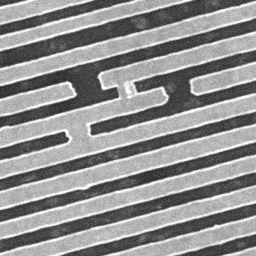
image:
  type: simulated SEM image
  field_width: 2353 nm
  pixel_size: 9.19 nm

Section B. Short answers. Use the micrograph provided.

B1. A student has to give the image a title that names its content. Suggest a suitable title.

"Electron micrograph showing parallel lines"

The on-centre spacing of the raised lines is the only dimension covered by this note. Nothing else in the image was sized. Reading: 274 nm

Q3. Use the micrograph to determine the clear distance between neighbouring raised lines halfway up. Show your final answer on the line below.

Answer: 14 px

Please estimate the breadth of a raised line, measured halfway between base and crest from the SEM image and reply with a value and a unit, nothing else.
146 nm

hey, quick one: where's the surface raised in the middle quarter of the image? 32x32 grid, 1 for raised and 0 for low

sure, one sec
11000000000000001111111111111110
00000000000111111111111111110000
00000000011111111111111100000000
00000000011111111111000000000000
00000000011111111000000000000000
11000000001111111000000000000000
11000000000000111100001110000000
11100000000000111111111110000000
10000000000000111111111111000000
00000000001111111111111110000000
00000001111111111111111000000000
00011111111111111111000000000000
11111111111111110000000000000111
11111111111000000000000001111111
11111111000000000000011111111111
11111100000000000111111111111111
11111100000000111111111111111000
01111100011111111111111111000000
01111111111111111111110000000000
01111111111111111100000000000001
11111111111111000000000000011111
11111111110000000000000011111111
11111110000000000000111111111111
11100000000000001111111111111111
00000000000111111111111111110000
00000000111111111111111110000000
00000111111111111111100000000000
11111111111111111000000000000001
11111111111111000000000000111111
11111111100000000000000111111111
11111100000000000000111111111111
11000000000000001111111111111100